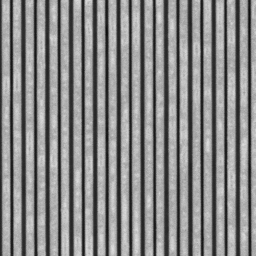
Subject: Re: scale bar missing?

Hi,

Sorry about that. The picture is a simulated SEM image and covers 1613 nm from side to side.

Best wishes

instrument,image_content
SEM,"parallel lines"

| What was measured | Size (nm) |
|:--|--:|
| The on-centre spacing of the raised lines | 75.1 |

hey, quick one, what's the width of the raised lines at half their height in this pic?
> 55.1 nm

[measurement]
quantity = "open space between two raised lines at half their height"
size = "18.9 nm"